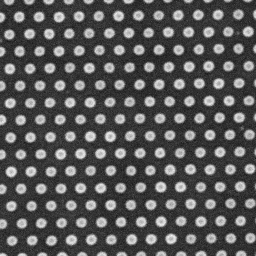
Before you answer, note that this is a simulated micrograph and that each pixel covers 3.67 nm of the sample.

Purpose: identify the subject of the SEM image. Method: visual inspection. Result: a regular array of raised bodies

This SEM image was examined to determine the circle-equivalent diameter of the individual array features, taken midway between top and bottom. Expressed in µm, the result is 0.0339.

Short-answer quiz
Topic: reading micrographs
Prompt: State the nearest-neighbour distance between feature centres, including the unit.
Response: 71.5 nm